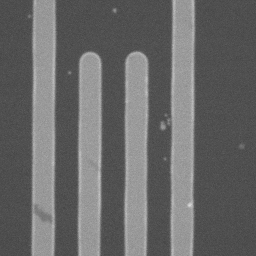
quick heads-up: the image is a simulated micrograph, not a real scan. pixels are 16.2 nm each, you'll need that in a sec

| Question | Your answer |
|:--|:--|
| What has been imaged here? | groups of lines, slits or small figures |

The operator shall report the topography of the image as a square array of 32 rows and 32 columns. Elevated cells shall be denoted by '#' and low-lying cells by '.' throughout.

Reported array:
....###...............##........
....###...............##........
....###...............##........
....###...............##........
....###...............##........
....###...............##........
....###...............##........
....###...##....##....##........
....###...###...##....##........
....###...###...##....##........
....###...###...##....##........
....###...###...##....##........
....###...###...##....##........
....###...###...##....##........
....###...###...##...###........
....###...###...##....##........
....###...###...##....##........
....###...###...##....##........
....###...###...##....##........
....###...###...##...###........
....###...##....##...###........
....###...##....##...###........
....###...##....##...###........
....###...##....##....##........
....###...##....##....##........
....###...##....##....##........
....###...##....##...###........
....###...##....##...###........
....###...##....##...###........
....###...##....##...###........
....###...##....##...###........
....###...##....##....##........